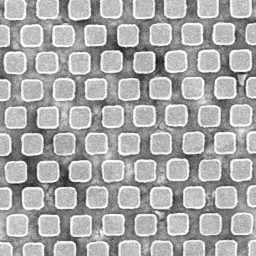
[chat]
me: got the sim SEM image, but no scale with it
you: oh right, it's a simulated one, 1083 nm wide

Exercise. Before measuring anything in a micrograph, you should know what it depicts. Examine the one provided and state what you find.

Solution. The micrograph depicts a regular array of raised bodies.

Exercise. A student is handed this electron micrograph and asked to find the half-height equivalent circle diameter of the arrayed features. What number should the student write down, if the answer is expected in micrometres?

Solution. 0.0975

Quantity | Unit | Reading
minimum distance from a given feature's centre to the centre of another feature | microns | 0.132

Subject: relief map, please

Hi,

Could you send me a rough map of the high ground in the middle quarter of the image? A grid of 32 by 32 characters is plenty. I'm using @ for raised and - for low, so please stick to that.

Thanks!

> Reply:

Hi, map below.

-@@@@@---@@@@@---@@@@@@--@@@@@@-
-@@@@@----@@@@----@@@@----@@@@--
--------------------------------
-------------------------------@
@@---@@@@@----@@@@@---@@@@----@@
@@---@@@@@----@@@@@---@@@@@---@@
@@---@@@@@----@@@@@---@@@@@---@@
@@---@@@@@----@@@@@---@@@@@---@@
@@----@@@@----@@@@@---@@@@----@@
--------------------------------
------------------@@@@----@@@@--
--@@@@@---@@@@@---@@@@@---@@@@@-
--@@@@@---@@@@@---@@@@@---@@@@@-
--@@@@@---@@@@@---@@@@@---@@@@@-
--@@@@@---@@@@@---@@@@@---@@@@@-
--@@@@----@@@@----@@------------
--------------------------------
------@@@@-----@@@----@@@@----@@
@@@---@@@@@---@@@@@---@@@@@---@@
@@@---@@@@@---@@@@@---@@@@@---@@
@@@---@@@@@---@@@@@---@@@@@---@@
@@@---@@@@@---@@@@@---@@@@@---@@
@------------------------------@
--------------------------------
--@@@@----@@@@@---@@@@@---@@@@@-
--@@@@@---@@@@@---@@@@@---@@@@@-
--@@@@----@@@@@---@@@@@---@@@@@-
--@@@@@---@@@@@---@@@@@---@@@@@-
--@@@@----@@@@@---@@@@@---@@@@@-
--------------------------------
--------------------------------
@@@---@@@@@---@@@@@---@@@@@---@@